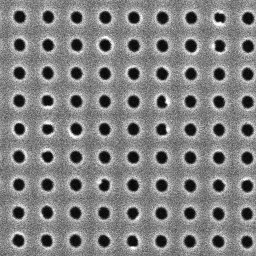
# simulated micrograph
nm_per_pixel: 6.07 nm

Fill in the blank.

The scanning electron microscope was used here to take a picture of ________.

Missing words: a regular array of holes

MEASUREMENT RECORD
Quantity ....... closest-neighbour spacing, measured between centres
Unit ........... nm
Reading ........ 169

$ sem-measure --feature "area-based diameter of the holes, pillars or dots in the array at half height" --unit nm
71.2